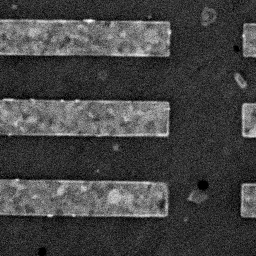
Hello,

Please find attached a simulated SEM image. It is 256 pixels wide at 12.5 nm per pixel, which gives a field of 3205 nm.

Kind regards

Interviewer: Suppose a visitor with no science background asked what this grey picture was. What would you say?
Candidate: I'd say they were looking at wiring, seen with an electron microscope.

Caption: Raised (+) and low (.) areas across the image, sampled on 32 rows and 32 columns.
................................
................................
................................
+++++++++++++++++++++..........+
+++++++++++++++++++++..........+
+++++++++++++++++++++..........+
+++++++++++++++++++++..........+
................................
................................
................................
..............................+.
................................
................................
+++++++++++++++++++++..........+
+++++++++++++++++++++..........+
+++++++++++++++++++++..........+
+++++++++++++++++++++.........++
................................
................................
................................
................................
................................
................................
+++++++++++++++++++++.........++
+++++++++++++++++++++...+.....++
+++++++++++++++++++++.........++
+++++++++++++++++++++.........++
................................
................................
................................
................................
................................